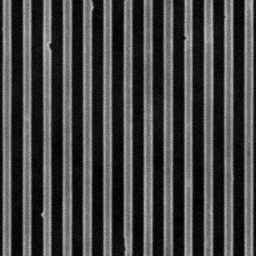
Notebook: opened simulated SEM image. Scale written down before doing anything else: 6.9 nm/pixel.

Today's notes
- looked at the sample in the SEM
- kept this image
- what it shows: parallel lines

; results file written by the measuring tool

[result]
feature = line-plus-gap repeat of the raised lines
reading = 139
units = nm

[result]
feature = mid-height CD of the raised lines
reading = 52.6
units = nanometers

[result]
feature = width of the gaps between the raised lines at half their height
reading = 12.6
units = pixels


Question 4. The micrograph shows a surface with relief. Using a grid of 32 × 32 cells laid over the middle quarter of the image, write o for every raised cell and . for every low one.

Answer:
oo...oo...oo...oo...oo...oo...oo
oo...oo...oo...oo...oo...oo...oo
oo...oo...oo...oo...oo...oo...oo
oo...oo...oo...oo...oo...oo...oo
oo...oo...oo...oo...oo...oo...oo
oo...oo...oo...oo...oo...oo...oo
oo...oo...oo...oo...oo...oo...oo
oo...oo...oo...oo...oo...oo...oo
oo...oo...oo...oo...oo...oo...oo
oo...oo...oo...oo...oo...oo...oo
oo...oo...oo...oo...oo...oo...oo
oo...oo...oo...oo...oo...oo...oo
oo...oo...oo...oo...oo...oo...oo
oo...oo...oo...oo...oo...oo...oo
oo...oo...oo...oo...oo...oo...oo
oo...oo...oo...oo...oo...oo...oo
oo...oo...oo...oo...oo...oo...oo
oo...oo...oo...oo...oo...oo...oo
oo...oo...oo...oo...oo...oo...oo
oo...oo...oo...oo...oo...oo...oo
oo...oo...oo...oo...oo...oo...oo
oo...oo...oo...oo...oo...oo...oo
oo...oo...oo...oo...oo...oo...oo
oo...oo...oo...oo...oo...oo...oo
oo...oo...oo...oo...oo...oo...oo
oo...oo...oo...oo...oo...oo...oo
oo...oo...oo...oo...oo...oo...oo
oo...oo...oo...oo...oo...oo...oo
oo...oo...oo...oo...oo...oo...oo
oo...oo...oo...oo...oo...oo...oo
oo...oo...oo...oo...oo...oo...oo
oo...oo...oo...oo...oo...oo...oo